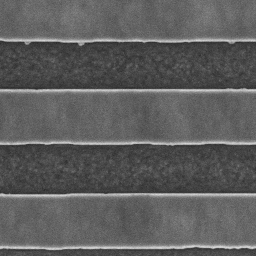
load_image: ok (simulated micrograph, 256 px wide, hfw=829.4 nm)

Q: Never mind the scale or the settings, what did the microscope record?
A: lines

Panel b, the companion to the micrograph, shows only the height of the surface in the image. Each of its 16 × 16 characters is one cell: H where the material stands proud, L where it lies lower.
HHHHHHHHHHHHHHHH
HHHHHHHHHHHHHHHH
HHHHHHHHHHHHHHHH
LLLLLLLLLLLLLLLL
LLLLLLLLLLLLLLLL
LLLLLLLLLLLLLLLL
HHHHHHHHHHHHHHHH
HHHHHHHHHHHHHHHH
HHHHHHHHHHHHHHHH
LLLLLLLLLLLLLLLL
LLLLLLLLLLLLLLLL
LLLLLLLLLLLLLLLL
HHHHHHHHHHHHHHHH
HHHHHHHHHHHHHHHH
HHHHHHHHHHHHHHHH
HHHHHHHHHHHHLLHH